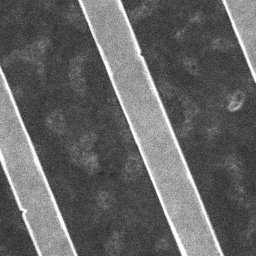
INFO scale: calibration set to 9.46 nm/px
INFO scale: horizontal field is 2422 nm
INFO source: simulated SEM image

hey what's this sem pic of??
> one or a few lines or trenches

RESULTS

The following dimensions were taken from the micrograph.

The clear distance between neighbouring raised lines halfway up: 930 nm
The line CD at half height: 346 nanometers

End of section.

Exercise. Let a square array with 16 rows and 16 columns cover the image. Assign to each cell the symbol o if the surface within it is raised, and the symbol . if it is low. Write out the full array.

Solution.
.....ooo......oo
......oo.......o
......oo.......o
......ooo......o
.......oo.......
o......ooo......
o.......oo......
o.......oo......
oo......ooo.....
oo.......oo.....
ooo......ooo....
.oo.......oo....
.oo.......ooo...
.ooo......ooo...
..oo.......oo...
..ooo......ooo..